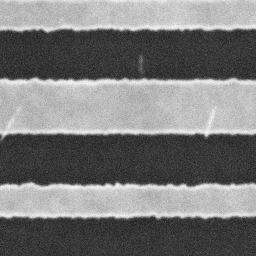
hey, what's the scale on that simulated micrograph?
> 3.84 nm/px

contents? lines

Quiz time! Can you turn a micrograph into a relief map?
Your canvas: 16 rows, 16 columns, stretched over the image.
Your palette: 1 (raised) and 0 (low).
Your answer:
1111111111111111
1111111111111111
0000000000000000
0000000000000000
0000000000000000
1111111111111111
1111111111111111
1111111111111111
0000000000000000
0000000000000000
0000000000000000
0000000000000000
1111111111111111
1111111111111111
0000000000000000
0000000000000000